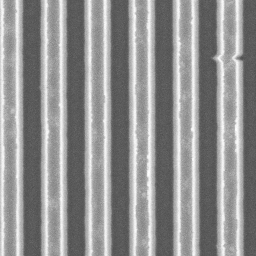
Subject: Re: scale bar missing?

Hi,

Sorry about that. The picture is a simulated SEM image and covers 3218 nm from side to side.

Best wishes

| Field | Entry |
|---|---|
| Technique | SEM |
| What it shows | parallel lines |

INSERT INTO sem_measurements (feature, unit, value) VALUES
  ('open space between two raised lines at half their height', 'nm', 302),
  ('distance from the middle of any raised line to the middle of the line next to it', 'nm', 553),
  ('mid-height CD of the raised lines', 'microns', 0.251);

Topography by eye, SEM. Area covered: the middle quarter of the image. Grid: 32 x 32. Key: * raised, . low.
......*****......*****......****
......*****......*****......****
......*****......*****......****
......*****......*****......****
......*****......*****......****
......*****......*****......****
......*****......*****......****
......*****......*****......****
......*****......*****......****
......*****......*****......****
......*****......*****......****
......*****......*****......****
......*****......*****......****
......*****......*****......****
......*****......*****......****
......*****......*****......****
......*****......*****......****
......*****......*****......****
......*****......*****......****
......*****......*****......****
......*****......*****......****
......*****......*****......****
......*****......*****......****
......*****......*****......****
......*****......*****......****
......*****......*****......****
......*****......*****......****
......*****......*****......****
......*****......*****......****
......*****......*****......****
......*****......*****......****
......*****......*****......****